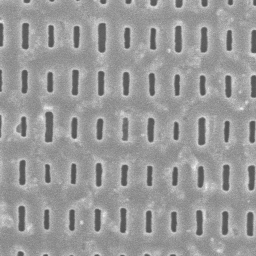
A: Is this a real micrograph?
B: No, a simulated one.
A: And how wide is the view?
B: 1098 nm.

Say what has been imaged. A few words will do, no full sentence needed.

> a regular array of holes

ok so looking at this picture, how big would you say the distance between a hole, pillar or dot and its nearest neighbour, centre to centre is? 109 nm